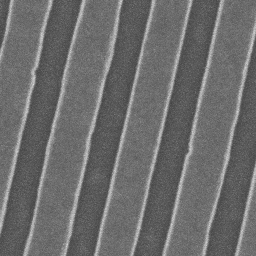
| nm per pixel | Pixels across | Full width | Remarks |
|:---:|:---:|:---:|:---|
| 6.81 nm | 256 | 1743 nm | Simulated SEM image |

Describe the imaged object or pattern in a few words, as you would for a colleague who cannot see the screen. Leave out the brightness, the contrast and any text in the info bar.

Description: one or a few lines or trenches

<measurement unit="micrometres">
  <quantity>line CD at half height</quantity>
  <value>0.255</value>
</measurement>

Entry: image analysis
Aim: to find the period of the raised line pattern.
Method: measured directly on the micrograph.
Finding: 0.465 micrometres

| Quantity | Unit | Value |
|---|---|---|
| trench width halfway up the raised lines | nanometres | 208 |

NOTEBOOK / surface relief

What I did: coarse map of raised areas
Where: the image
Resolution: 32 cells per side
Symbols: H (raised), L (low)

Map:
LHHHHHLLLLHHHHHLLLLHHHHHLLLLHHHH
LHHHHHLLLLHHHHHLLLLHHHHHLLLHHHHH
LHHHHHLLLLHHHHHLLLLHHHHLLLLHHHHH
LHHHHLLLLLHHHHHLLLHHHHHLLLLHHHHH
LHHHHLLLLHHHHHLLLLHHHHHLLLLHHHHH
HHHHHLLLLHHHHHLLLLHHHHHLLLHHHHHL
HHHHHLLLLHHHHHLLLLHHHHLLLLHHHHHL
HHHHHLLLLHHHHHLLLLHHHHLLLLHHHHHL
HHHHLLLLHHHHHLLLLHHHHHLLLLHHHHHL
HHHHLLLLHHHHHLLLLHHHHHLLLLHHHHHL
HHHHLLLLHHHHHLLLLHHHHHLLLHHHHHLL
HHHHLLLLHHHHHLLLLHHHHLLLLHHHHHLL
HHHHLLLHHHHHLLLLHHHHHLLLLHHHHHLL
HHHLLLLHHHHHLLLLHHHHHLLLLHHHHHLL
HHHLLLLHHHHHLLLLHHHHHLLLLHHHHHLL
HHHLLLLHHHHHLLLLHHHHLLLLHHHHHLLL
HHHLLLLHHHHLLLLHHHHHLLLLHHHHHLLL
HHLLLLHHHHHLLLLHHHHHLLLLHHHHHLLL
HHLLLLHHHHHLLLLHHHHHLLLLHHHHHLLL
HHLLLLHHHHHLLLLHHHHLLLLHHHHHLLLL
HHLLLLHHHHHLLLLHHHHLLLLHHHHHLLLL
HHLLLHHHHHLLLLHHHHHLLLLHHHHHLLLL
HLLLLHHHHHLLLLHHHHHLLLLHHHHHLLLL
HLLLLHHHHHLLLLHHHHLLLLLHHHHHLLLH
HLLLLHHHHHLLLLHHHHLLLLHHHHHLLLLH
HLLLLHHHHLLLLHHHHHLLLLHHHHHLLLLH
LLLLHHHHHLLLLHHHHHLLLLHHHHHLLLLH
LLLLHHHHHLLLLHHHHHLLLLHHHHLLLLLH
LLLLHHHHHLLLLHHHHLLLLHHHHHLLLLHH
LLLLHHHHHLLLLHHHHLLLLHHHHHLLLLHH
LLLLHHHHLLLLHHHHHLLLLHHHHHLLLLHH
LLLHHHHHLLLLHHHHHLLLLHHHHHLLLLHH